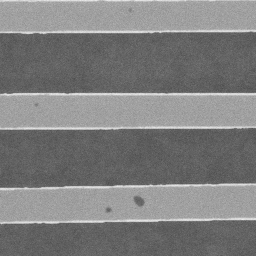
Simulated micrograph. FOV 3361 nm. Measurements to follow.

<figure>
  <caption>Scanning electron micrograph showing lines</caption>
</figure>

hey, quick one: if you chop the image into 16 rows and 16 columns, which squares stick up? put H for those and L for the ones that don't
HHHHHHHHHHHHHHHH
HHHHHHHHHHHHHHHH
LLLLLLLLLLLLLLLL
LLLLLLLLLLLLLLLL
LLLLLLLLLLLLLLLL
LLLLLLLLLLLLLLLL
HHHHHHHHHHHHHHHH
HHHHHHHHHHHHHHHH
LLLLLLLLLLLLLLLL
LLLLLLLLLLLLLLLL
LLLLLLLLLLLLLLLL
LLLLLLLLLLLLLLLL
HHHHHHHHHHHHHHHH
HHHHHHHHHHHHHHHH
LLLLLLLLLLLLLLLL
LLLLLLLLLLLLLLLL